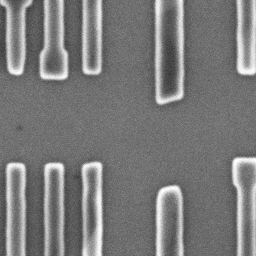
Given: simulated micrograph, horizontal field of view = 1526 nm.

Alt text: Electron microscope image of wiring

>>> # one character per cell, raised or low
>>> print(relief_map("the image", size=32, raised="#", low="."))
####..##..###.......###.......##
.##...##..###.......###.......##
.##...##..###.......###.......##
.##...##..###.......###.......##
.##...##..###.......###.......##
.##...##..###.......###.......##
.##..###..###.......###.......##
.##..###..###.......###.......##
.##..###..###.......###.......##
.....###............###.........
....................###.........
....................###.........
....................##..........
................................
................................
................................
................................
................................
................................
................................
.##...#....#.................###
.##...##..###................###
.##...##..###................###
.##...##..###........#........##
.##...##..###.......###.......##
.##...##..###.......###.......##
.##...##..###.......###.......##
.##...##..###.......###.......##
.##...##..###.......###.......##
.##...##..###.......###.......##
.##...##..###.......###.......##
.##...##..###.......###.......##